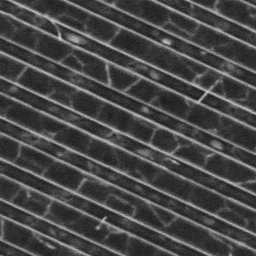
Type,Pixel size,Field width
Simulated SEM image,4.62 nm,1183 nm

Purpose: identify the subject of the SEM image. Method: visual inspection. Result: parallel lines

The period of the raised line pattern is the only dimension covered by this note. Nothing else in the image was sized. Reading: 171 nanometres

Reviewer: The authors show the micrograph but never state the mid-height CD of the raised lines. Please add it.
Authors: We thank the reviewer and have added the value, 108 nanometres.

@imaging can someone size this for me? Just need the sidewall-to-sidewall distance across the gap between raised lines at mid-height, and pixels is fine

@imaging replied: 13.4